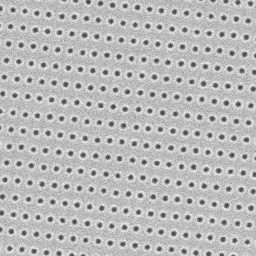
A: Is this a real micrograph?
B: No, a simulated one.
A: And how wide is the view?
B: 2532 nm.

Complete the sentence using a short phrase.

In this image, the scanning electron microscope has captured a regular array of holes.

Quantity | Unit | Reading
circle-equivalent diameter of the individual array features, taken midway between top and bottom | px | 5.86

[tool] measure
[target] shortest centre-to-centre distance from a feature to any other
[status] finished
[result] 120 nanometers